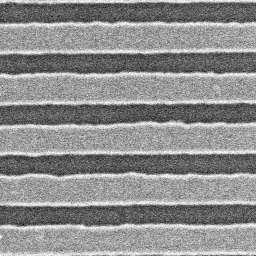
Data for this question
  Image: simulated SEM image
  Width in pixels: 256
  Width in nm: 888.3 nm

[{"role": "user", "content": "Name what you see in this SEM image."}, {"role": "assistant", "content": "lines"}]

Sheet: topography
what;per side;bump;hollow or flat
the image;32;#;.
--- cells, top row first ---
................................
................................
................................
################################
################################
################################
#######################.........
................................
................................
################################
################################
################################
################################
................................
................................
.................#####..####...#
################################
################################
################################
................................
................................
................................
################################
################################
################################
#################...##.##......#
................................
................................
################################
################################
################################
################################